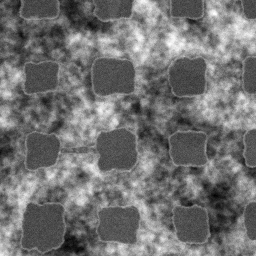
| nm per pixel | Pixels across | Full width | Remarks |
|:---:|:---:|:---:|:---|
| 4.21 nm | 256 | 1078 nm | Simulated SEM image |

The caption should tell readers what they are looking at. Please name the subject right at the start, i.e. raised bodies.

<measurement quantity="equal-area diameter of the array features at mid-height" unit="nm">178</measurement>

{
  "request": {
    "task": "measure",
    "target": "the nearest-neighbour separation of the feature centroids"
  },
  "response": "304 nm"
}